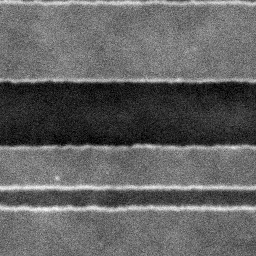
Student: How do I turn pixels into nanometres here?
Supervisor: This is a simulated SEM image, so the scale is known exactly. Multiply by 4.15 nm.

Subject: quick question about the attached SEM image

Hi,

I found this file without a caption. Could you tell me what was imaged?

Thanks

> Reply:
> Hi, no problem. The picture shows lines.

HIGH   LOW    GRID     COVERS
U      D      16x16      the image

UUUUUUUUUUUUUUUU
UUUUUUUUUUUUUUUU
UUUUUUUUUUUUUUUU
UUUUUUUUUUUUUUUU
UUUUUUUUUUUUUUUU
DDDDDDDDDDDDDDDD
DDDDDDDDDDDDDDDD
DDDDDDDDDDDDDDDD
DDDDDDDDDDDDDDDD
UUUUUUUUUUUUUUUU
UUUUUUUUUUUUUUUU
UUUUUUUUUUUUUUUU
UUUUUUUUUUUUUUUU
UUUUUUUUUUUUUUUU
UUUUUUUUUUUUUUUU
UUUUUUUUUUUUUUUU